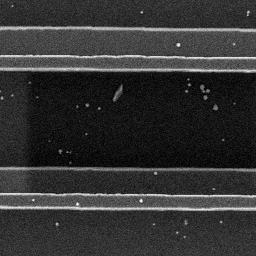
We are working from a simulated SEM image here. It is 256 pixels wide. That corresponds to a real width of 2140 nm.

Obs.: lines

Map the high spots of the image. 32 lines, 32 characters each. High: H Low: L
LLLLLLLLLLLLLLLLLLLLLLLLLLLLLLLL
LLLLLLLLLLLLLLLLLLLLLLLLLLLLLLLL
LLLLLLLLLLLLLLLLLLLLLLLLLLLLLLLL
LLLLLLLLLLLLLLLLLLLLLLLLLLLLLLLL
HHHHHHHHHHHHHHHHHHHHHHHHHHHHHHHH
HHHHHHHHHHHHHHHHHHHHHHHHHHHHHHHH
HHHHHHHHHHHHHHHHHHHHHHHHHHHHHHHH
HHHHHHHHHHHHHHHHHHHHHHHHHHHHHHHH
HHHHHHHHHHHHHHHHHHHHHHHHHHHHHHHH
LLLLLLLLLLLLLLLLLLLLLLLLLLLLLLLL
LLLLLLLLLLLLLLLLLLLLLLLLLLLLLLLL
LLLLLLLLLLLLLLLLLLLLLLLLLLLLLLLL
LLLLLLLLLLLLLLLLLLLLLLLLLLLLLLLL
LLLLLLLLLLLLLLLLLLLLLLLLLLLLLLLL
LLLLLLLLLLLLLLLLLLLLLLLLLLLLLLLL
LLLLLLLLLLLLLLLLLLLLLLLLLLLLLLLL
LLLLLLLLLLLLLLLLLLLLLLLLLLLLLLLL
LLLLLLLLLLLLLLLLLLLLLLLLLLLLLLLL
LLLLLLLLLLLLLLLLLLLLLLLLLLLLLLLL
LLLLLLLLLLLLLLLLLLLLLLLLLLLLLLLL
LLLLLLLLLLLLLLLLLLLLLLLLLLLLLLLL
HHHHHHHHHHHHHHHHHHHHHHHHHHHHHHHH
HHHHHHHHHHHHHHHHHHHHHHHHHHHHHHHH
HHHHHHHHHHHHHHHHHHHHHHHHHHHHHHHH
HHHHHHHHHHHHHHHHHHHHHHHHHHHHHHHH
HHHHHHHHHHHHHHHHHHHHHHHHHHHHHHHH
LLLLLLLLLLLLLLLLLLLLLLLLLLLLLLLL
LLLLLLLLLLLLLLLLLLLLLLLLLLLLLLLL
LLLLLLLLLLLLLLLLLLLLLLLLLLLLLLLL
LLLLLLLLLLLLLLLLLLLLLLLLLLLLLLLL
LLLLLLLLLLLLLLLLLLLLLLLLLLLLLLLL
LLLLLLLLLLLLLLLLLLLLLLLLLLLLLLLL